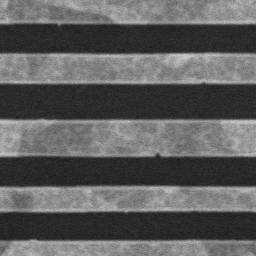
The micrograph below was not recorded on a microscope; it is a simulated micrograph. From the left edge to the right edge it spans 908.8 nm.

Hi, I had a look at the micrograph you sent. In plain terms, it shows one or a few lines or trenches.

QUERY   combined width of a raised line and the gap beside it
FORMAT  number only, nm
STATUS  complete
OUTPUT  231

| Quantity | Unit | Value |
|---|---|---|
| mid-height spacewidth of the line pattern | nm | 116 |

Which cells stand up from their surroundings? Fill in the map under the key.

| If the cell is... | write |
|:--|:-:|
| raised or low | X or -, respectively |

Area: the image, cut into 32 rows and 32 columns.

XXXXXXXXXXXXXXXXXXXXXXXXXXXXXXXX
XXXXXXXXXXXXXXXXXXXXXXXXXXXXXXXX
XXXXXXXXXXXXXXXXXXXXXXXXXXXXXXXX
--------------------------------
--------------------------------
--------------------------------
--------------------------------
XXXXXXXXXXXXXXXXXXXXXXXXXXXXXXXX
XXXXXXXXXXXXXXXXXXXXXXXXXXXXXXXX
XXXXXXXXXXXXXXXXXXXXXXXXXXXXXXXX
--------------------------------
--------------------------------
--------------------------------
--------------------------------
--------------------------------
XXXXXXXXXXXXXXXXXXXXXXXXXXXXXXXX
XXXXXXXXXXXXXXXXXXXXXXXXXXXXXXXX
XXXXXXXXXXXXXXXXXXXXXXXXXXXXXXXX
XXXXXXXXXXXXXXXXXXXXXXXXXXXXXXXX
--------------------------------
--------------------------------
--------------------------------
--------------------------------
--------------------------------
XXXXXXXXXXXXXXXXXXXXXXXXXXXXXXXX
XXXXXXXXXXXXXXXXXXXXXXXXXXXXXXXX
--------------------------------
--------------------------------
--------------------------------
--------------------------------
XXXXXXXXXXXXXXXXXXXXXXXXXXXXXXXX
XXXXXXXXXXXXXXXXXXXXXXXXXXXXXXXX